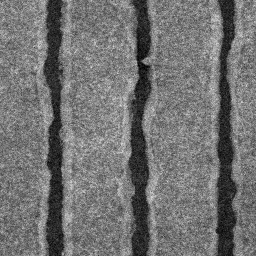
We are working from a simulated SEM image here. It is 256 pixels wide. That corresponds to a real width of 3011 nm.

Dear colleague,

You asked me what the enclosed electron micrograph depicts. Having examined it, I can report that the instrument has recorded one or a few lines or trenches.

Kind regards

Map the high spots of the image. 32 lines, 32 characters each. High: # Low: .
#####....#######...########...##
######...#######...########...##
#####....#######...########...##
#####...########...########...##
#####...########...########...##
#####...#########..########...##
#####...#########..########...##
#####....########.#########..###
#####....########..########..###
#####....########..########..###
#####...########...########..###
#####...########...########..###
######..########...########..###
######..########...########..###
######..########...########...##
######...#######...########...##
######...#######..#########...##
######...######...#########..###
######...#######...########..###
######...#######...########...##
#####....#######...########...##
######...#######...########...##
######...######....########...##
######...######....########...##
######...######....########...##
######...#######...########...##
#####....#######...########...##
#####....#######...########...##
#####....#######...########...##
#####....#######...########...##
#####....#######...########...##
#####....#######...########...##